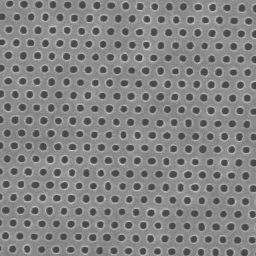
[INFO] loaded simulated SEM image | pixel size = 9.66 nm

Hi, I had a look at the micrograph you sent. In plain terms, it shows a regular array of holes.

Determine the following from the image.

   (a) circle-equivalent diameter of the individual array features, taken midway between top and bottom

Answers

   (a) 0.069 microns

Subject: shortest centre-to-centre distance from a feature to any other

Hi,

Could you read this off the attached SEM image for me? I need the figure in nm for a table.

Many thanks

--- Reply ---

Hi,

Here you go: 137